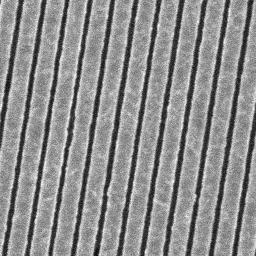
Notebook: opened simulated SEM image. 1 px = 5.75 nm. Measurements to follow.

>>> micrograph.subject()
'parallel lines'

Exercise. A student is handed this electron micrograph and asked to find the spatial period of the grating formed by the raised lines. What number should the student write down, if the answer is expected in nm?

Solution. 131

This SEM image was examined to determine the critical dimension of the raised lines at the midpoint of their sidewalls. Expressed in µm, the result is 0.0945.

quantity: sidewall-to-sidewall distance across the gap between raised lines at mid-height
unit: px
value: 6.3